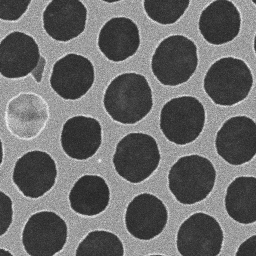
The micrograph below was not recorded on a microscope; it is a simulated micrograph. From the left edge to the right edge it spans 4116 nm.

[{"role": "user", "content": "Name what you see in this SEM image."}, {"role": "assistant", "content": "a regular array of holes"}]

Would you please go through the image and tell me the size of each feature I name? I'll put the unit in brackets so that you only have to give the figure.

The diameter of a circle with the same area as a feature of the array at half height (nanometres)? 747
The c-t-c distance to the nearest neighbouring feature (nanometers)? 945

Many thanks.